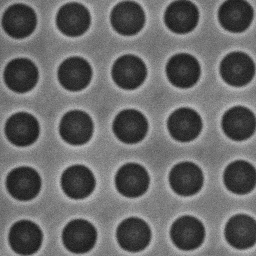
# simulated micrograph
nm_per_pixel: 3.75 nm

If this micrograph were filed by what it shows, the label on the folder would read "an array of small figures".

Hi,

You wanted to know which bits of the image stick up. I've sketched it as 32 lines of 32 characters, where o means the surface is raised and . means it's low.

oo.ooooo..oooo...oooo...oooo...o
....ooo....ooo....oo.....oo.....
.....oo....ooo....oo.....oo.....
.....oo....ooo....ooo...oooo...o
o...oooo..ooooo..ooooooooooooooo
oooooooooooooooooooooooooooooooo
ooooooooooooooooooooooooooooo..o
o...oooo...ooo....ooo....ooo....
o....oo.....oo....ooo....oo.....
.....oo.....oo....ooo....ooo....
o....oo....ooo....ooo....ooo...o
oo..ooooo.oooooooooooooooooooooo
oooooooooooooooooooooooooooooooo
oooooooooooooooooooooo..ooooo..o
o...oooo...ooo....ooo....ooo....
o....oo.....oo.....oo....ooo....
o....oo.....oo.....oo....ooo....
o....ooo...oooo...oooo..ooooo..o
oooooooooooooooooooooooooooooooo
oooooooooooooooooooooooooooooooo
oooooooooooooooo.ooooo...oooo..o
o....ooo....ooo....oo....ooo....
o....oo.....oo.....oo.....oo....
o....ooo....oo.....oo....ooo....
o....ooo...oooo...oooo..oooooooo
oooooooooooooooooooooooooooooooo
oooooooooooooooooooooooooooooooo
oo..ooooo..oooo...oooo...ooo....
o....ooo....ooo....oo.....oo....
o....ooo....oo.....oo.....oo....
o....ooo....ooo....ooo...oooo...
oo...oooo..ooooo.ooooooooooooooo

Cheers